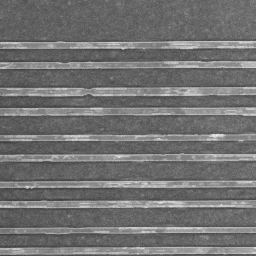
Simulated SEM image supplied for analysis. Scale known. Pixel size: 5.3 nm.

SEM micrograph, parallel lines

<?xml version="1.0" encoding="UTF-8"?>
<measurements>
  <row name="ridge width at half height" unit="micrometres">0.0351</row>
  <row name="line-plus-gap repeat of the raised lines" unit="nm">121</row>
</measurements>